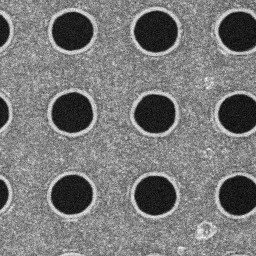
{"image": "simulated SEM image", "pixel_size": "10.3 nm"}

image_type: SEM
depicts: raised bodies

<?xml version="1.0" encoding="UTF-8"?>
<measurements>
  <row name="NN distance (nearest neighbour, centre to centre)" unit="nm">837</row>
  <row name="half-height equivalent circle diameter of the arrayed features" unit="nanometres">462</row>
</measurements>